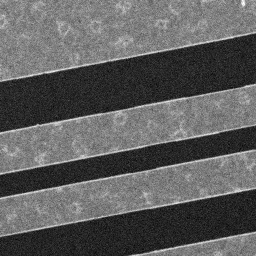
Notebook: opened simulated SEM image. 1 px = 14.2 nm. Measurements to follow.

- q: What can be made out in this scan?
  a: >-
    one or a few lines or trenches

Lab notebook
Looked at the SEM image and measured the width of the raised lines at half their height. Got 555 nm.